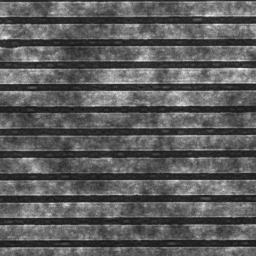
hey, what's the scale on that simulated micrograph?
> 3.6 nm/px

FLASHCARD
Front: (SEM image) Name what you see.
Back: parallel lines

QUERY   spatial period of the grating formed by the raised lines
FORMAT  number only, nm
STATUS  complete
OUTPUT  80.4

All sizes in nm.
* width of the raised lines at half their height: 52.7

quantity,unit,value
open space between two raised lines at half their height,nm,29.7